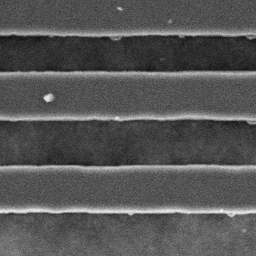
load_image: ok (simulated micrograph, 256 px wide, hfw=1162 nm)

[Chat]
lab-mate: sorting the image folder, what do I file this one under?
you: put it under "lines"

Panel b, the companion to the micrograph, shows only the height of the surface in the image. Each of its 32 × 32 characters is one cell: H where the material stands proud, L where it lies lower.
HHHHHHHHHHHHHHHHHHHHHHHHHHHHHHHH
HHHHHHHHHHHHHHHHHHHHHHHHHHHHHHHH
HHHHHHHHHHHHHHHHHHHHHHHHHHHHHHHH
HHHHHHHHHHHHHHHHHHHHHHHHHHHHHHHH
LLLLLLLLLLHHHHLLLLLLLLLLLLLLLLLL
LLLLLLLLLLLLLLLLLLLLLLLLLLLLLLLL
LLLLLLLLLLLLLLLLLLLLLLLLLLLLLLLL
LLLLLLLLLLLLLLLLLLLLLLLLLLLLLLLL
LLLLLLLLLLLLLLLLLLLLLLLLLLLLLLLL
HHHHHHHHHHHHHHHHHHHHHHHHHHHHHHHH
HHHHHHHHHHHHHHHHHHHHHHHHHHHHHHHH
HHHHHHHHHHHHHHHHHHHHHHHHHHHHHHHH
HHHHHHHHHHHHHHHHHHHHHHHHHHHHHHHH
HHHHHHHHHHHHHHHHHHHHHHHHHHHHHHHH
HHHHHHHHHHHHHHHHHHHHHHHHHHHHHHHH
LLLLLLLLLLLLLLLLLLLLLLLLLLLLLLLL
LLLLLLLLLLLLLLLLLLLLLLLLLLLLLLLL
LLLLLLLLLLLLLLLLLLLLLLLLLLLLLLLL
LLLLLLLLLLLLLLLLLLLLLLLLLLLLLLLL
LLLLLLLLLLLLLLLLLLLLLLLLLLLLLLLL
LLLLLLLLLLLLLLLLLLLLLLLLLLLLLLLL
HHHHHHHHHHHHHHHHHHHHHHHHHHHHHHHH
HHHHHHHHHHHHHHHHHHHHHHHHHHHHHHHH
HHHHHHHHHHHHHHHHHHHHHHHHHHHHHHHH
HHHHHHHHHHHHHHHHHHHHHHHHHHHHHHHH
HHHHHHHHHHHHHHHHHHHHHHHHHHHHHHHH
LLLLLLHHLLLLLLLLLHHLLLLHHLLLHHHL
LLLLLLLLLLLLLLLLLLLLLLLLLLLLLLLL
LLLLLLLLLLLLLLLLLLLLLLLLLLLLLLLL
LLLLLLLLLLLLLLLLLLLLLLLLLLLLLLLL
LLLLLLLLLLLLLLLLLLLLLLLLLLLLLLLL
LLLLLLLLLLLLLLLLLLLLLLLLLLLLLLLL